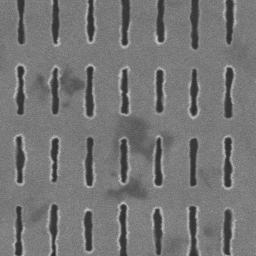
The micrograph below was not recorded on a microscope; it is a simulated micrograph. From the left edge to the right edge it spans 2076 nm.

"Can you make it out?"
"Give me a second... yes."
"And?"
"a regular array of holes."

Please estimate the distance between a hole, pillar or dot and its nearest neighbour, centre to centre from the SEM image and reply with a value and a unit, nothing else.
280 nm